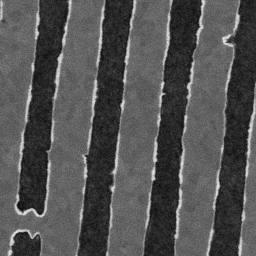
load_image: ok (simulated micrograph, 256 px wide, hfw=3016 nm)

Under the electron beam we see one or a few lines or trenches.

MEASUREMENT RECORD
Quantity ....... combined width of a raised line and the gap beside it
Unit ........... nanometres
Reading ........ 777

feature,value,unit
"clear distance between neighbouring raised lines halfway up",319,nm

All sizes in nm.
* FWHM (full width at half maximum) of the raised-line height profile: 452